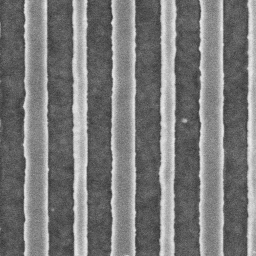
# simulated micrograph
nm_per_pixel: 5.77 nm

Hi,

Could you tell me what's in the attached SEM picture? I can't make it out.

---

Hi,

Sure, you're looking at lines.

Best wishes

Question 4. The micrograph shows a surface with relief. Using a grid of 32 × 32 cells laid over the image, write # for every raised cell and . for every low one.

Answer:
...###...##...###...##...###...#
...###...##...###...##...###...#
...###...##...###...##...###...#
...###...##...###...##...###...#
...###...##...###...##...###...#
...###...##...###...##...###...#
...###...##...###...##...###...#
...###...##...###...##...###...#
...###...##...###...##...###...#
...###...##...###...##...###...#
...###...##...###...##...###...#
...###...##...###...##...###...#
...###...##...###...##...###...#
...###...##...###...##...###...#
...###...##...###...##...###...#
...###...##...###...##...###...#
...###...##...###...##...###...#
...###...##...###...##...###...#
...###...##...###...##...###...#
...###...##...###...##...###...#
...###...##...###...##...###...#
...###...##...###...##...###...#
...###...##...###...##...###...#
...###...##...###...##...###...#
...###...##...###...##...###...#
...###...##...###...##...###...#
...###...##...###...##...###...#
...###...##...###...##...###...#
...###...##...###...##...###...#
...###...##...###...##...###...#
...###...##...###...##...###...#
...###...##...###...##...###...#